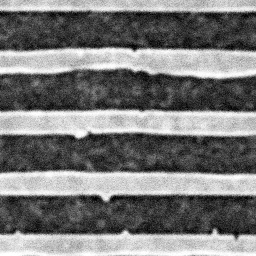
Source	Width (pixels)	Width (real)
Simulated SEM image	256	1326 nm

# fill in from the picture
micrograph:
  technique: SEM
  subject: one or a few lines or trenches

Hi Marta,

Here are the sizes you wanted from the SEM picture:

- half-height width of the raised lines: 0.103 µm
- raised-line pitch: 318 nanometers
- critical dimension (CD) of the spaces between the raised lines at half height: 216 nanometres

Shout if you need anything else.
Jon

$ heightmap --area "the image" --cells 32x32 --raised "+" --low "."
++++++++++++++++++++++++++++++++
................................
................................
................................
................................
................................
......++++++++++++++++++++++....
++++++++++++++++++++++++++++++++
++++++++++......++++++++++++++++
................................
................................
................................
................................
................................
++++++++++++++++++++++++++++++++
++++++++++++++++++++++++++++++++
+++++++++++.........++++++++++++
................................
................................
................................
................................
................................
++++++++++++++++++++++++++++++++
++++++++++++++++++++++++++++++++
.............+..................
................................
................................
................................
................................
.++.++++++++++.++.........+.....
++++++++++++++++++++++++++++++++
++++++++++++++++++++++++++++++++